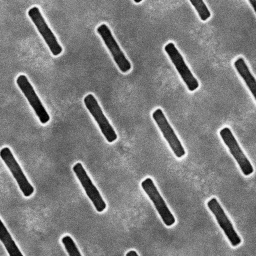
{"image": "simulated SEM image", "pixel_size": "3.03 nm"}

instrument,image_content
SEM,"a regular array of holes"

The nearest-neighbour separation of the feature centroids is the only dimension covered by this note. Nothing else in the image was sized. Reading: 0.208 um